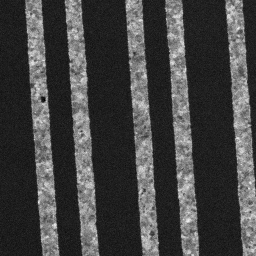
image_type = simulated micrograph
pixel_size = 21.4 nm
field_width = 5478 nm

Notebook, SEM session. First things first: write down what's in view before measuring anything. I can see parallel lines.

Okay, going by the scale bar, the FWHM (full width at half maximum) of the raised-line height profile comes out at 0.336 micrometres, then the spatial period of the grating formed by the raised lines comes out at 1.06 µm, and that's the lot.